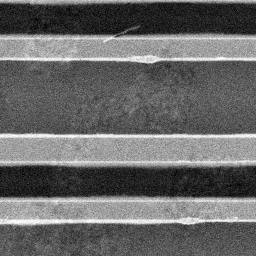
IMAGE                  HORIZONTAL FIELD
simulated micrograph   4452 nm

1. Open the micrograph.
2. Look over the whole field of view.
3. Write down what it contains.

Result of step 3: lines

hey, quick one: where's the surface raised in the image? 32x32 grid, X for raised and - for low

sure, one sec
--------------------------------
--------------------------------
--------------------------------
--------------------------------
--------------------------------
XXXXXXXXXXXXXXXXXXXXXXXXXXXXXXXX
XXXXXXXXXXXXXXXXXXXXXXXXXXXXXXXX
----------------XXXX------------
--------------------------------
--------------------------------
--------------------------------
--------------------------------
--------------------------------
--------------------------------
--------------------------------
--------------------------------
--------------------------------
XXXXXXXXXXXXXXXXXXXXXXXXXXXXXXXX
XXXXXXXXXXXXXXXXXXXXXXXXXXXXXXXX
XXXXXXXXXXXXXXXXXXXXXXXXXXXXXXXX
--------------------------------
--------------------------------
--------------------------------
--------------------------------
--------------------------------
XXXXXXXXXXXXXXXXXXXXXXXXXXXXXXXX
XXXXXXXXXXXXXXXXXXXXXXXXXXXXXXXX
XXXXXXXXXXXXXXXXXXXXXXXXXXXXXXXX
--------------------------------
--------------------------------
--------------------------------
--------------------------------